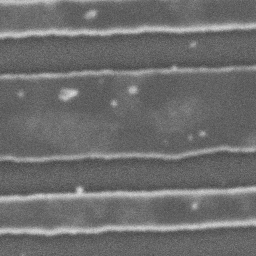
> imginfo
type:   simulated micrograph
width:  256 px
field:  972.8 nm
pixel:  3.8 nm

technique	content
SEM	lines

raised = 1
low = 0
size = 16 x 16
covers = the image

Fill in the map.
1111111111111111
1111111111111111
0000000000000000
0000000000000000
0000001011111111
1111111111111111
1111111111111111
1111111111111111
1111111111111111
1111111111111000
0000000000000000
0000000000000000
1111111111111111
1111111111111111
0011000000000000
0000000000000000